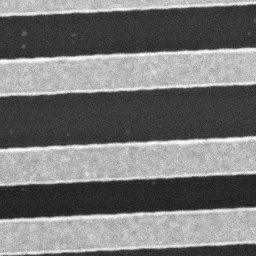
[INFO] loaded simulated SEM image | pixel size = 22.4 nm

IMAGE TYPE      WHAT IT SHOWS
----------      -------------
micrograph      lines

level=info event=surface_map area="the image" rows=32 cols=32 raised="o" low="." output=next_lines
ooooooooooooooooooooooooooooooo.
oooooooooooo....................
................................
................................
................................
................................
......................oooooooooo
..oooooooooooooooooooooooooooooo
oooooooooooooooooooooooooooooooo
oooooooooooooooooooooooooooooooo
oooooooooooooooooooooooooooooooo
oooooooo........................
................................
................................
................................
................................
................................
..........................oooooo
....oooooooooooooooooooooooooooo
oooooooooooooooooooooooooooooooo
oooooooooooooooooooooooooooooooo
oooooooooooooooooooooooooooooooo
oooooooooooooo..................
................................
................................
................................
......................oooooooooo
oooooooooooooooooooooooooooooooo
oooooooooooooooooooooooooooooooo
oooooooooooooooooooooooooooooooo
oooooooooooooooooooooooooooo....
oooooooo........................